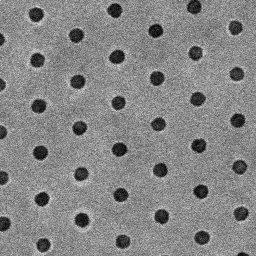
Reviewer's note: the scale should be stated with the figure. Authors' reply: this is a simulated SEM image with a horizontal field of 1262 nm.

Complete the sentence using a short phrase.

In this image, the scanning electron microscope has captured a regular array of holes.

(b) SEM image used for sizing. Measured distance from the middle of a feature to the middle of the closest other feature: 0.225 microns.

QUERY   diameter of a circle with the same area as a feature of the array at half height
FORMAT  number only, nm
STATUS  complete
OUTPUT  76.8